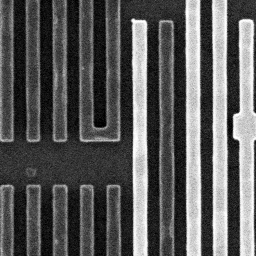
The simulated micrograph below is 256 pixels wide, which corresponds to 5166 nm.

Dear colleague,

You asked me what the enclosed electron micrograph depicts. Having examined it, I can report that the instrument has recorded wiring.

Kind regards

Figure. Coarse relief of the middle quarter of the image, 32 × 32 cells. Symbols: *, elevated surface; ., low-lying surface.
....***....***...****...***....*
....***....***...****...***....*
....***....***...****...***....*
....***....***...****...***....*
....***....***...****...***....*
....***....***...****...***....*
....***....***...****...***....*
....***....***...****...***....*
*...***....***...****...***....*
*...***....***...****...***....*
*...***....***...****...***....*
*...***....***...****...***....*
*...***....***...****...***....*
*...***....***...****...***....*
*...***....***...****...***....*
*...***...****...****...***....*
*...**********...****...***....*
*...**********...****...***....*
*...**********...****...***....*
.................****...***....*
.................****...***....*
.................****...***....*
.................****...***....*
.................****...***....*
.................****...***....*
.................****...***....*
.................****...***....*
.................****...***....*
.................****...***....*
.................****...***....*
.....**....***...****...***....*
*...***....***...****...***....*